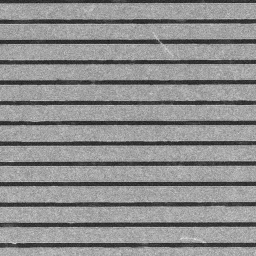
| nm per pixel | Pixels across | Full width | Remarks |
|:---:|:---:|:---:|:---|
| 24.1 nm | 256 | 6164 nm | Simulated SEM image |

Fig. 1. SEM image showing parallel lines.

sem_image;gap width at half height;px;5.12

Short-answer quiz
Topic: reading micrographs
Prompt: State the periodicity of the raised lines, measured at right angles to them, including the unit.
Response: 490 nanometres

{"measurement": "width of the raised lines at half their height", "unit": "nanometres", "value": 367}